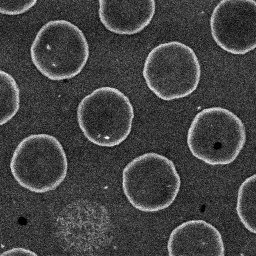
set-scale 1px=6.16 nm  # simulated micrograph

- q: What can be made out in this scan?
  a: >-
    raised bodies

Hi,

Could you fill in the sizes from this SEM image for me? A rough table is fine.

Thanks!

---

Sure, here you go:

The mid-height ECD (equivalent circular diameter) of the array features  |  342 nm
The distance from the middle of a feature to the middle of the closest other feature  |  79.8 px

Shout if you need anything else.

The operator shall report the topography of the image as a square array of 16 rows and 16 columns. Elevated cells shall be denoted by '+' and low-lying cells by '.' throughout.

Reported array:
++....++++....++
...+...++....+++
..+++.........++
..+++....+++....
...++....+++....
+.........++....
+....+++........
.....+++....+++.
.....+++....+++.
.+++........+++.
.+++....+++.....
.++.....+++....+
........+++....+
...............+
...........+++..
...........+++..